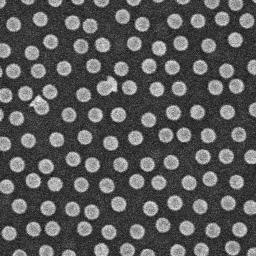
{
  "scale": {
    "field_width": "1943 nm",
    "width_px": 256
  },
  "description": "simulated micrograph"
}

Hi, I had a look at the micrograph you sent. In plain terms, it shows a regular array of raised bodies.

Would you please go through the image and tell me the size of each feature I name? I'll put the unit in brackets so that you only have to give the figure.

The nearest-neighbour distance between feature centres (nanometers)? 166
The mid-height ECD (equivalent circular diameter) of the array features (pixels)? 14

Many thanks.